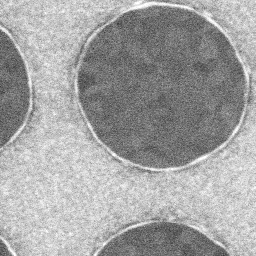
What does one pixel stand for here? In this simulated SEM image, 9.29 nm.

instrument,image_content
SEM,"raised bodies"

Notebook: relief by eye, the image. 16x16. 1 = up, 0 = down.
0000000011110000
0000000111111000
1000001111111100
1000011111111110
1100011111111110
1100011111111111
1100011111111110
1100011111111110
1000001111111110
0000000111111000
0000000001100000
0000000000000000
0000000000000000
0000000000000000
0000000011111000
1000001111111100